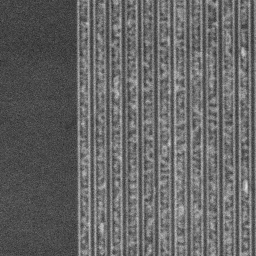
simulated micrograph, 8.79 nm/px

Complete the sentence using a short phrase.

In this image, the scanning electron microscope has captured parallel lines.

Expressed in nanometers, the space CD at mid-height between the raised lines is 85.7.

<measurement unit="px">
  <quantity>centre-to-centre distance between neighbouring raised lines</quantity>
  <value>16.1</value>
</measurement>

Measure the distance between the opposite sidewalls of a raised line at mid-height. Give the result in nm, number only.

54.9